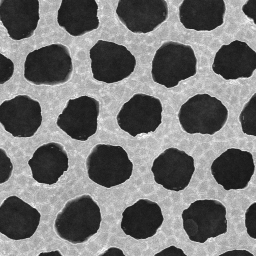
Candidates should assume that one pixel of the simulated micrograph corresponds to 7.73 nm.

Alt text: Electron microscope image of a regular array of holes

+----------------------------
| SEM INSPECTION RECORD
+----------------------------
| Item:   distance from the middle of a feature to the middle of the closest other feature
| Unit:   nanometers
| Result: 454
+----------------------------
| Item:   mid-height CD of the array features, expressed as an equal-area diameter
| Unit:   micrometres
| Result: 0.339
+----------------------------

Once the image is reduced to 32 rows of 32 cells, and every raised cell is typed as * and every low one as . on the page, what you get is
.....***....***......**.....***.
.....**.....***......*......**..
.....**.....***......**.....***.
*...****....****...****....*****
*...****************************
************...******.*******..*
****....***.....****....***.....
.**......**......**......**.....
..*......**......**......**.....
.**......***....***.....****...*
********************..**********
********************************
*...*****...****....****...****.
.....***....***.....***.....***.
.....**.....***.....**......**..
.....**.....***.....***.....**..
*...****....****...****....****.
**********.*********************
*****...****...*****************
.***....***.....****....***....*
..**....***......**.....**......
.***....***......**.....**......
.***...*****....***.....***....*
*********************..*****..**
********************************
....*****...*****...****....****
.....***.....**.....***.....***.
.....**......**.....***.....***.
.....**.....***.....***.....***.
*...****...*****...*****...****.
********************************
******.******..*****...*****...*